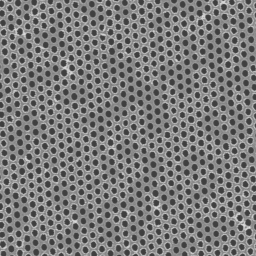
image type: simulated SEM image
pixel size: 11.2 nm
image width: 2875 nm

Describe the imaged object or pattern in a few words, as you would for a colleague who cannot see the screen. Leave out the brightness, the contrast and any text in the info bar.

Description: a regular array of holes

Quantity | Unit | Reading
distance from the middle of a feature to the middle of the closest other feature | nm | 104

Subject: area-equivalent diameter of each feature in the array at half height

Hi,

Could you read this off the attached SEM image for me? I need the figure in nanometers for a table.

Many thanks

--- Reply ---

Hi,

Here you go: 68.2